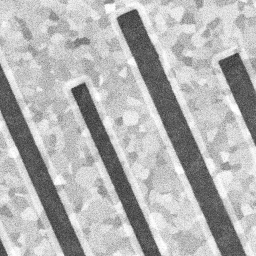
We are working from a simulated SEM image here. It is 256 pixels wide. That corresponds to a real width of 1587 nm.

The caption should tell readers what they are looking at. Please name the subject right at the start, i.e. one or a few lines or trenches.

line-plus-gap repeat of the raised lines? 443 nanometers